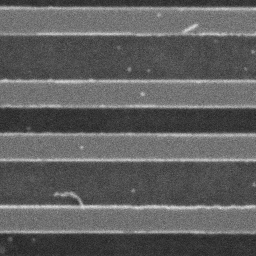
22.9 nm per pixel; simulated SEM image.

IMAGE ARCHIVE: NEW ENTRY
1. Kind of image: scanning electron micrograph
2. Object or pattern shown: lines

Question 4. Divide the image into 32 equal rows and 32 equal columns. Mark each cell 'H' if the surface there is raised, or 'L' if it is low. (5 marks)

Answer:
LLLLLLLLLLLLLLLLLLLLLLLLLLLLLLLL
HHHHHHHHHHHHHHHHHHHHHHHHHHHHHHHH
HHHHHHHHHHHHHHHHHHHHHHHHHHHHHHHH
HHHHHHHHHHHHHHHHHHHHHHHHHHHHHHHH
LLLLLLLLLLLLLLLLLLLLLLLLLLLLLLLL
LLLLLLLLLLLLLLLLLLLLLLLLLLLLLLLL
LLLLLLLLLLLLLLLLLLLLLLLLLLLLLLLL
LLLLLLLLLLLLLLLLLLLLLLLLLLLLLLLL
LLLLLLLLLLLLLLLLLLLLLLLLLLLLLLLL
LLLLLLLLLLLLLLLLLLLLLLLLLLLLLLLL
HHHHHHHHHHHHHHHHHHHHHHHHHHHHHHHH
HHHHHHHHHHHHHHHHHHHHHHHHHHHHHHHH
HHHHHHHHHHHHHHHHHHHHHHHHHHHHHHHH
LLLLLLLLLLLLLLLLLLLLLLLLLLLLLLLL
LLLLLLLLLLLLLLLLLLLLLLLLLLLLLLLL
LLLLLLLLLLLLLLLLLLLLLLLLLLLLLLLL
LLLLLLLLLLLLLLLLLLLLLLLLLLLLLLLL
HHHHHHHHHHHHHHHHHHHHHHHHHHHHHHHH
HHHHHHHHHHHHHHHHHHHHHHHHHHHHHHHH
HHHHHHHHHHHHHHHHHHHHHHHHHHHHHHHH
LLLLLLLLLLLLLLLLLLLLLLLLLLLLLLLL
LLLLLLLLLLLLLLLLLLLLLLLLLLLLLLLL
LLLLLLLLLLLLLLLLLLLLLLLLLLLLLLLL
LLLLLLLLLLLLLLLLLLLLLLLLLLLLLLLL
LLLLLLLLLLLLLLLLLLLLLLLLLLLLLLLL
LLLLLLLLLLLLLLLLLLLLLLLLLLLLLLLL
HHHHHHHHHHHHHHHHHHHHHHHHHHHHHHHH
HHHHHHHHHHHHHHHHHHHHHHHHHHHHHHHH
HHHHHHHHHHHHHHHHHHHHHHHHHHHHHHHH
LLLLLLLLLLLLLLLLLLLLLLLLLLLLLLLL
LLLLLLLLLLLLLLLLLLLLLLLLLLLLLLLL
LLLLLLLLLLLLLLLLLLLLLLLLLLLLLLLL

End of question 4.